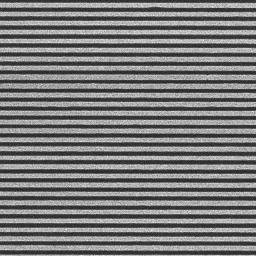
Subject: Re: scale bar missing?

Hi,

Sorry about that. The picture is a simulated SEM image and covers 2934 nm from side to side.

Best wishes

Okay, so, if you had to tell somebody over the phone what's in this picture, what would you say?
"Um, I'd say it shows parallel lines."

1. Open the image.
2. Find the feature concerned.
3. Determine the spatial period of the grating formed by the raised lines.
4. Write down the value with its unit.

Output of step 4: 103 nm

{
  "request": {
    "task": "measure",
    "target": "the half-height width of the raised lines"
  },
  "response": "54.5 nanometres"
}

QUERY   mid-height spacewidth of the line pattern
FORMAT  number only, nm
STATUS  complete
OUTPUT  44.4